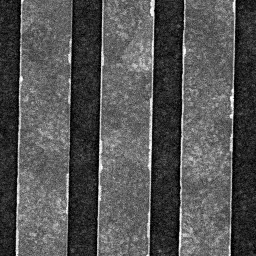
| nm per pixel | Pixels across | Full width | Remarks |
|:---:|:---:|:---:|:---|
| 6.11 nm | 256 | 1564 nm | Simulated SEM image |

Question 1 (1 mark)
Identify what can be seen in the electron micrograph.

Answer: one or a few lines or trenches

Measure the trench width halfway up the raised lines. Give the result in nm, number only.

188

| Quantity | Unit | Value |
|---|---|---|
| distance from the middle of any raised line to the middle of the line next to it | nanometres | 498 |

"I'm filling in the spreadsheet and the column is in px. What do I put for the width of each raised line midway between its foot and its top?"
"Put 50.8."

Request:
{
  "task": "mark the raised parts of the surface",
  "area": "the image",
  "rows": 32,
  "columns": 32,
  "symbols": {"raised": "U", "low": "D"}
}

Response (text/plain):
DDDUUUUUUDDDDUUUUUUDDDDUUUUUUDDD
DDDUUUUUUDDDDUUUUUUDDDDUUUUUUDDD
DDDUUUUUUDDDDUUUUUUDDDDUUUUUUDDD
DDDUUUUUUDDDDUUUUUUDDDDUUUUUUDDD
DDDUUUUUUDDDDUUUUUUDDDDUUUUUUDDD
DDDUUUUUUDDDDUUUUUUDDDDUUUUUUDDD
DDDUUUUUUDDDDUUUUUUDDDDUUUUUUDDD
DDDUUUUUUDDDDUUUUUUDDDDUUUUUUDDD
DDDUUUUUUDDDDUUUUUUDDDDUUUUUUDDD
DDDUUUUUUDDDDUUUUUUDDDDUUUUUUDDD
DDDUUUUUUDDDDUUUUUUDDDDUUUUUUDDD
DDDUUUUUUDDDDUUUUUUDDDDUUUUUUDDD
DDUUUUUUUDDDDUUUUUUDDDDUUUUUUDDD
DDUUUUUUUDDDDUUUUUUDDDDUUUUUUDDD
DDUUUUUUUDDDDUUUUUUDDDDUUUUUUDDD
DDUUUUUUUDDDDUUUUUUDDDDUUUUUUDDD
DDUUUUUUUDDDDUUUUUUDDDDUUUUUUDDD
DDUUUUUUUDDDDUUUUUUDDDDUUUUUUDDD
DDUUUUUUUDDDUUUUUUUDDDDUUUUUUDDD
DDUUUUUUUDDDUUUUUUUDDDDUUUUUUDDD
DDUUUUUUUDDDUUUUUUUDDDDUUUUUUDDD
DDUUUUUUUDDDUUUUUUUDDDDUUUUUUDDD
DDUUUUUUUDDDUUUUUUUDDDDUUUUUUDDD
DDUUUUUUUDDDUUUUUUUDDDDUUUUUUDDD
DDUUUUUUDDDDUUUUUUUDDDDUUUUUUDDD
DDUUUUUUDDDDUUUUUUUDDDDUUUUUUDDD
DDUUUUUUDDDDUUUUUUUDDDDUUUUUUDDD
DDUUUUUUDDDDUUUUUUUDDDDUUUUUUDDD
DDUUUUUUDDDDUUUUUUUDDDDUUUUUUDDD
DDUUUUUUDDDDUUUUUUUDDDDUUUUUUDDD
DDUUUUUUDDDDUUUUUUUDDDDUUUUUUDDD
DDUUUUUUDDDDUUUUUUUDDDUUUUUUUDDD